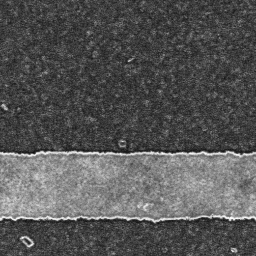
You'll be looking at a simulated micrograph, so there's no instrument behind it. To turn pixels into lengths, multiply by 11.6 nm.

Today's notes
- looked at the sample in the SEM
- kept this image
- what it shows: one or a few lines or trenches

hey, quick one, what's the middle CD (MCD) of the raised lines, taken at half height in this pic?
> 750 nm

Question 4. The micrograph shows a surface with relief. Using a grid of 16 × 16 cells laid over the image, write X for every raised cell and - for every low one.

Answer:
----------------
----------------
----------------
----------------
----------------
----------------
----------------
----------------
----------------
----------------
XXXXXXXXXXXXXXXX
XXXXXXXXXXXXXXXX
XXXXXXXXXXXXXXXX
XXXXXXXXXXXXXXXX
----------------
----------------